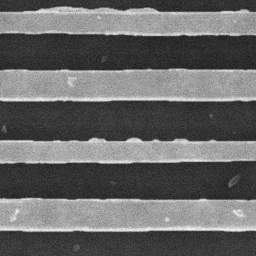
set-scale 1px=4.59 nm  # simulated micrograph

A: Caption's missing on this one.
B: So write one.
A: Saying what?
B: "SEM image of lines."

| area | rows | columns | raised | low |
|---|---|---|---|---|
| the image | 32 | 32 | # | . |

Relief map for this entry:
................................
...#####...................###..
################################
################################
................................
................................
................................
................................
................................
################################
################################
################################
.###..................#######...
................................
................................
................................
................................
................................
################################
################################
................................
................................
................................
................................
................................
################################
################################
################################
################################
................................
................................
................................